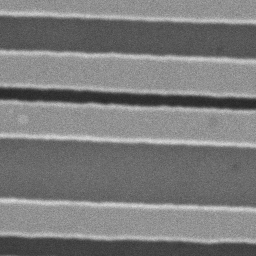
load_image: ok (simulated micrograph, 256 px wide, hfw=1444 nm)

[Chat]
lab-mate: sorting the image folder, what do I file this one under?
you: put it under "lines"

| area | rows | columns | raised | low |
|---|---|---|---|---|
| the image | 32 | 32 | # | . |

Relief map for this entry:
################################
################################
..................##############
................................
................................
................................
######..........................
###############################.
################################
################################
################################
................################
................................
#########################.......
################################
################################
################################
...........#####################
................................
................................
................................
................................
................................
................................
................................
###############.................
################################
################################
################################
..##############################
................................
................................